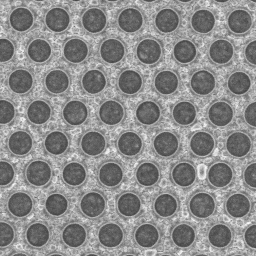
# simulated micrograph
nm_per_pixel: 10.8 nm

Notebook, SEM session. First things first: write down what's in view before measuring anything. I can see a regular array of holes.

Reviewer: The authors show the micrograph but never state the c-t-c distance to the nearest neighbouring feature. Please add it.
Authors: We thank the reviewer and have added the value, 382 nm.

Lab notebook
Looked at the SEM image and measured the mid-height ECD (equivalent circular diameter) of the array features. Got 260 nm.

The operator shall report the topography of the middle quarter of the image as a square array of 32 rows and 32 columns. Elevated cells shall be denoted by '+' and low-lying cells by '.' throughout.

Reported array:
++++++++++++++++++++++++++++++++
++++++..++++++++.+++++++++++++++
.++++.....++++.....+++++....++++
.++++.....++++.....++++.....++++
.++++......+++......+++......+++
.++++.....++++.....++++.....++++
+++++.....++++.....++++.....++++
++++++++++++++++..+++++++..+++++
++++++++++++++++++++++++++++++++
+...++++++...+++++++..+++++++..+
.....++++.....++++.....+++++....
......+++......+++......+++.....
......+++......+++......+++.....
......+++......+++......+++.....
+....+++++....+++++....+++++....
++++++++++++++++++++++++++++++++
++++++++++++++++++++++++++++++++
+++++....++++++...++++++...+++++
.++++.....++++.....++++.....++++
.+++......+++.......++.......++.
.+++......++++......++.......+++
.++++.....++++.....++++.....++++
++++++...++++++...++++++...+++++
++++++++++++++++++++++++++++++++
++.+++++++++++++++++++++++++++++
.....+++++....+++++....+++++....
.....++++......+++......+++.....
......+++......+++......+++.....
.....++++......+++......+++.....
+....++++.....+++++....+++++....
+++++++++++.++++++++..+++++++..+
++++++++++++++++++++++++++++++++